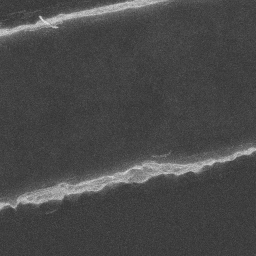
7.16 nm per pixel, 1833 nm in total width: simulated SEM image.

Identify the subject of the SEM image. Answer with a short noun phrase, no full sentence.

one or a few lines or trenches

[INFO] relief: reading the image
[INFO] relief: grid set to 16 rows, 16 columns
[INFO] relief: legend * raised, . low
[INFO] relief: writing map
.......*********
..**************
****************
****************
****************
****************
****************
****************
****************
***************.
************....
******..........
**..............
................
................
................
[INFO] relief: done